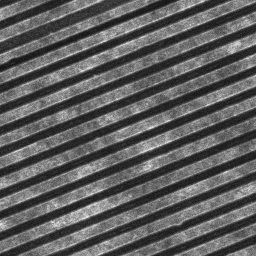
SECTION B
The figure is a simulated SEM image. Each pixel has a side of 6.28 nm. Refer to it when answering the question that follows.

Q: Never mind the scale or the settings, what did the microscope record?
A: parallel lines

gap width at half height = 0.0466 um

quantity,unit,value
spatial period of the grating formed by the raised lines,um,0.123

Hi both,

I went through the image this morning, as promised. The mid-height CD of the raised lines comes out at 12.1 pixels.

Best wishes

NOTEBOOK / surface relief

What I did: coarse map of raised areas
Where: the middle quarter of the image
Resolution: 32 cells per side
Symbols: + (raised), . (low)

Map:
.++++++++.....++++++++.....+++++
++++++.....++++++++.....++++++++
++++.....++++++++.....++++++++..
+.....++++++++.....++++++++.....
....++++++++.....++++++++......+
.++++++++.....++++++++......++++
+++++++.....++++++++.....+++++++
++++......+++++++......++++++++.
++.....++++++++......+++++++....
.....++++++++.....++++++++.....+
..++++++++......+++++++.....++++
++++++++.....++++++++.....++++++
+++++.....++++++++.....++++++++.
+++.....++++++++.....++++++++...
.....++++++++.....++++++++.....+
...++++++++.....++++++++.....+++
.+++++++.....++++++++.....++++++
++++++.....++++++++.....++++++++
+++.....++++++++.....++++++++...
+.....++++++++.....++++++++.....
...++++++++......+++++++......++
.++++++++.....++++++++.....+++++
++++++......++++++++.....+++++++
++++.....++++++++.....++++++++..
+......++++++++.....++++++++....
....++++++++.....++++++++.....++
..++++++++.....++++++++.....++++
+++++++.....++++++++.....+++++++
+++++.....++++++++.....++++++++.
++.....++++++++.....++++++++....
.....++++++++.....++++++++.....+
...+++++++.....++++++++.....++++